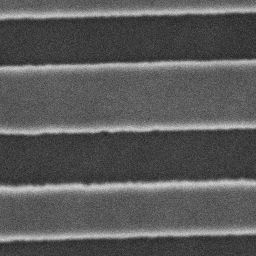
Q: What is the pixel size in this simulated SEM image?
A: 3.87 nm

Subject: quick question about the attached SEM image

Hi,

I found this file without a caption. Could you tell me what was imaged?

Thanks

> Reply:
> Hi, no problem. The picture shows lines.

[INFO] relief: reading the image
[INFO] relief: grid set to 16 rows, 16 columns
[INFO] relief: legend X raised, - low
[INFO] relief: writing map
XXXXXXXXXXXXXXXX
----------------
----------------
----------------
XXXXXXXXXXXXXXXX
XXXXXXXXXXXXXXXX
XXXXXXXXXXXXXXXX
XXXXXXXXXXXXXXXX
----------------
----------------
----------------
----------XXXXXX
XXXXXXXXXXXXXXXX
XXXXXXXXXXXXXXXX
XXXXXXXXXXXXXXXX
----------------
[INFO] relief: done